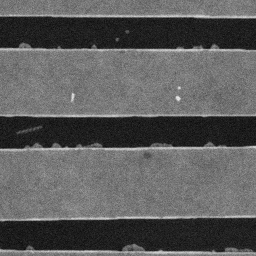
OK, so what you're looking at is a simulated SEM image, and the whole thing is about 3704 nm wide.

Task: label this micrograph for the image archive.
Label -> lines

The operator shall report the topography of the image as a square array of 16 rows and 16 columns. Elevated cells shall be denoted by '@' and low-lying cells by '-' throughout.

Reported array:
@@@@@@@@@@@@@@@@
----------------
----------------
@@@@@@@@@@@@@@@@
@@@@@@@@@@@@@@@@
@@@@@@@@@@@@@@@@
@@@@@@@@@@@@@@@@
----------------
----------------
@@@@@@@@@@@@@@@@
@@@@@@@@@@@@@@@@
@@@@@@@@@@@@@@@@
@@@@@@@@@@@@@@@@
@@@@@@@@@@@@@@@@
----------------
----------------